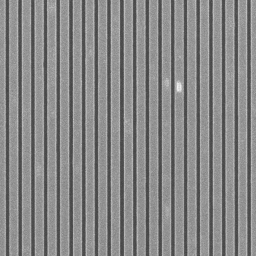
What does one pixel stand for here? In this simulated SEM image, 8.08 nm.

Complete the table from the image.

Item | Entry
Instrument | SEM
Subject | parallel lines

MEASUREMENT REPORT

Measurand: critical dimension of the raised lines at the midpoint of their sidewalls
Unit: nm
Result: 73.7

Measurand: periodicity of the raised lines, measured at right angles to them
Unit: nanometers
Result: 103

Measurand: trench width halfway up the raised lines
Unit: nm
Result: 29.3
